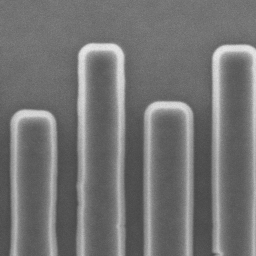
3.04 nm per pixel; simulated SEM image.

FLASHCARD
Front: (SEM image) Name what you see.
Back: one or a few lines or trenches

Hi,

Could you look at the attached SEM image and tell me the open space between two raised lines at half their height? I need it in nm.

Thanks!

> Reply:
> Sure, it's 78.4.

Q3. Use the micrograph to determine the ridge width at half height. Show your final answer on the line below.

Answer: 124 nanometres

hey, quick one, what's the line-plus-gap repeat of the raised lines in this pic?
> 204 nanometers